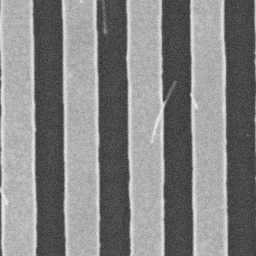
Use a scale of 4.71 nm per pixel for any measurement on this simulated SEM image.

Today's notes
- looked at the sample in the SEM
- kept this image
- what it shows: lines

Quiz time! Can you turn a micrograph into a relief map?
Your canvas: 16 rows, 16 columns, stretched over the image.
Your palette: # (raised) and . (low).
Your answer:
##..##..##..##..
##..##..##..##..
##..##..##..##..
##..##..##..##..
##..##..##..##..
##..##..##..##..
##..##..##..##..
##..##..##..##..
##..##..##..##..
##..##..##..##..
##..##..##..##..
##..##..##..##..
##..##..##..##..
##..##..##..##..
##..##..##..##..
##..##..##..##..